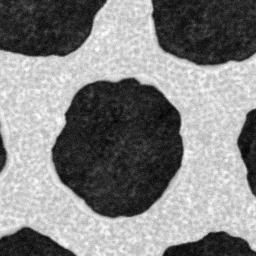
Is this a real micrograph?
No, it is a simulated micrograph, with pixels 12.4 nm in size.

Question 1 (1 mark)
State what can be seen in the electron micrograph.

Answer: holes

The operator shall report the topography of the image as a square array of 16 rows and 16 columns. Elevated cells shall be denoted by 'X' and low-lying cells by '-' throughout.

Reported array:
------XXXX------
------XXXX------
-----XXXXX------
XX--XXXXXXX-----
XXXXXXXXXXXXXXXX
XXXXX-----XXXXXX
XXXX-------XXXXX
XXXX-------XXXX-
XXXX-------XXXX-
XXX--------XXXX-
XXX--------XXXX-
XXXX-------XXXXX
XXXXX-----XXXXXX
XXXXXX--XXXXXXXX
--XXXXXXXXXXX-XX
----XXXXXXX-----